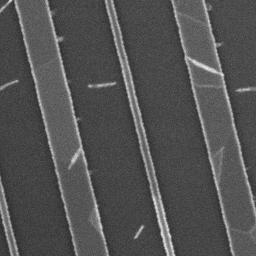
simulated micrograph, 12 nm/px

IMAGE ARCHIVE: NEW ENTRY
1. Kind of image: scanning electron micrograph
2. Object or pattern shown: lines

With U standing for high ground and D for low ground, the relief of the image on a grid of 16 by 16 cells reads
DUUDDDDDDDDUUDDD
DUUDDDDDDDDUUDDD
DDUUDDDDDDDUUDDD
DDUUDDDDDDDDUUDD
DDUUDDDDDDDDUUDD
DDUUDDDDDDDDUUDD
DDUUDDDDDDDDUUDD
DDDUUDDDDDDDDUUD
DDDUUDDDDDDDDUUD
DDDUUDDDDDDDDUUD
DDDUUDDDDUDDDUUD
DDDDUUDDDDDDDUUU
DDDDUUDDDDDDDDUU
DDDDUUDDDDDDDDUU
DDDDUUDDDDDDDDUU
DDDDDUUDDDDDDDUU